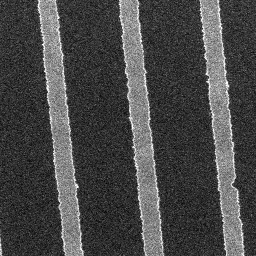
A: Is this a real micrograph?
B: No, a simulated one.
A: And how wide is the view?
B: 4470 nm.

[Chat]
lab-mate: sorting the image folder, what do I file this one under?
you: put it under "one or a few lines or trenches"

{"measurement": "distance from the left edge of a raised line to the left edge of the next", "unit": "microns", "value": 1.4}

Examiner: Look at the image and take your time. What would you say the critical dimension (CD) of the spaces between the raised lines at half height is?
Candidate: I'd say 1.09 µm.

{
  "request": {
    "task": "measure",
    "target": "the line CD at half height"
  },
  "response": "319 nanometres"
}